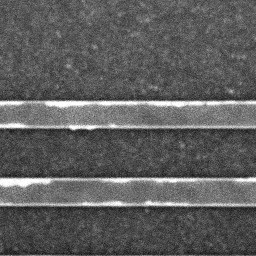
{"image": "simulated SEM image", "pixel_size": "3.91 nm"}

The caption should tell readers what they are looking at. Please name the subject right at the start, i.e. one or a few lines or trenches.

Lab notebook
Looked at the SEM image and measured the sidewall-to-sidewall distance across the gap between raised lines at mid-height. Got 199 nm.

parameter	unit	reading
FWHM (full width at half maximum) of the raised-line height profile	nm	101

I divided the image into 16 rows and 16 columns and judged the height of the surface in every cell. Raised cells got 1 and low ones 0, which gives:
0000000000000000
0000000000000000
0000000000000000
0000000000000000
0000000000000000
0000000000000000
1111111111111111
1111111111111111
0000000000000000
0000000000000000
0000000000000000
1111111111111111
1111111111111111
0000000000000000
0000000000000000
0000000000000000